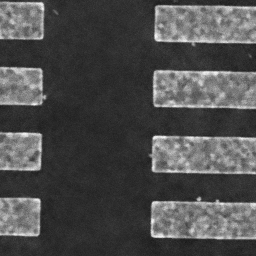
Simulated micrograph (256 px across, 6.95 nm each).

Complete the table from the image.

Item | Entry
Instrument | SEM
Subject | wiring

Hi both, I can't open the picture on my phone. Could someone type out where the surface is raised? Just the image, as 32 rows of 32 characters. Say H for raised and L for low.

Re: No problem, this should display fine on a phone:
HHHHHLLLLLLLLLLLLLLLLLLLLLLLLLLL
HHHHHLLLLLLLLLLLLLLHHHHHHHHHHHHH
HHHHHLLLLLLLLLLLLLLHHHHHHHHHHHHH
HHHHHLLLLLLLLLLLLLLHHHHHHHHHHHHH
HHHHHLLLLLLLLLLLLLLHHHHHHHHHHHHH
LLLLLLLLLLLLLLLLLLLLLLLLLLLLLLLL
LLLLLLLLLLLLLLLLLLLLLLLLLLLLLLLL
LLLLLLLLLLLLLLLLLLLLLLLLLLLLLLLL
HHHHLLLLLLLLLLLLLLLLLLLLLLLLLLLL
HHHHHLLLLLLLLLLLLLLHHHHHHHHHHHHH
HHHHHLLLLLLLLLLLLLLHHHHHHHHHHHHH
HHHHHLLLLLLLLLLLLLLHHHHHHHHHHHHH
HHHHHLLLLLLLLLLLLLLHHHHHHHHHHHHH
LLLLLLLLLLLLLLLLLLLLLLLLLLLLLHHH
LLLLLLLLLLLLLLLLLLLLLLLLLLLLLLLL
LLLLLLLLLLLLLLLLLLLLLLLLLLLLLLLL
LLLLLLLLLLLLLLLLLLLLLLLLLLLLLLLL
HHHHHLLLLLLLLLLLLLLHHHHHHHHHHHHH
HHHHHLLLLLLLLLLLLLLHHHHHHHHHHHHH
HHHHHLLLLLLLLLLLLLLHHHHHHHHHHHHH
HHHHHLLLLLLLLLLLLLLHHHHHHHHHHHHH
LLLLLLLLLLLLLLLLLLLLLLLLLHHHHHHH
LLLLLLLLLLLLLLLLLLLLLLLLLLLLLLLL
LLLLLLLLLLLLLLLLLLLLLLLLLLLLLLLL
LLLLLLLLLLLLLLLLLLLLLLLLLLLLLLLL
HHHHHLLLLLLLLLLLLLLHHHHHHHHHHHHH
HHHHHLLLLLLLLLLLLLLHHHHHHHHHHHHH
HHHHHLLLLLLLLLLLLLLHHHHHHHHHHHHH
HHHHHLLLLLLLLLLLLLLHHHHHHHHHHHHH
LLLLLLLLLLLLLLLLLLLHHHHHHHHHHHHH
LLLLLLLLLLLLLLLLLLLLLLLLLLLLLLLL
LLLLLLLLLLLLLLLLLLLLLLLLLLLLLLLL